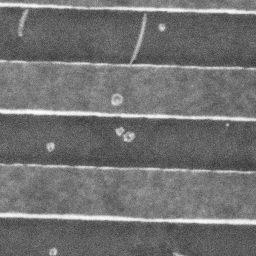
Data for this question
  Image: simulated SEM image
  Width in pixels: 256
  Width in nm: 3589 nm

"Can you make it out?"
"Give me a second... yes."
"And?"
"lines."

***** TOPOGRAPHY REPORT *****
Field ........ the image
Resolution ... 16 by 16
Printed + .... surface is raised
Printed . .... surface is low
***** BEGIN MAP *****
......++++++++++
................
................
................
++++++++++++++++
++++++++++++++++
++++++++++++++++
................
................
................
+++++++.........
++++++++++++++++
++++++++++++++++
..++++++++++++++
................
................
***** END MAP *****